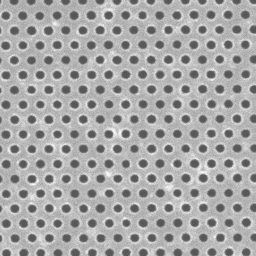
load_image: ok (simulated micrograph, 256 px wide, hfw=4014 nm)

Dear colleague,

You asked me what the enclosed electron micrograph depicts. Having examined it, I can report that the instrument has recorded a regular array of holes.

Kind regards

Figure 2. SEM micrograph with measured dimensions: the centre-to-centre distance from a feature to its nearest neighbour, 264 nanometers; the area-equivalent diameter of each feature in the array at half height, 146 nanometers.